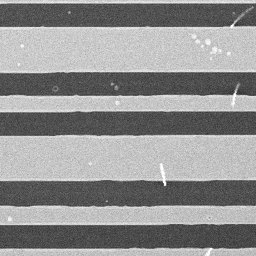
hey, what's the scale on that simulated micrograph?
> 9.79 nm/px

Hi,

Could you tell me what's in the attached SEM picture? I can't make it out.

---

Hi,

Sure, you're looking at lines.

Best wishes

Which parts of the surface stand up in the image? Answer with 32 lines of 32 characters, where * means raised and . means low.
................................
................................
................................
********************************
********************************
********************************
********************************
********************************
********************************
................................
................................
................................
********************************
********************************
................................
................................
................................
********************************
********************************
********************************
********************************
********************************
*************.***.*********.....
................................
................................
................................
********************************
********************************
................................
................................
................................
********************************